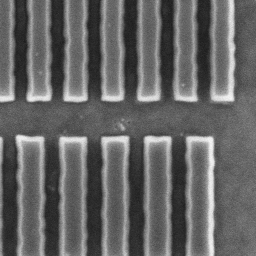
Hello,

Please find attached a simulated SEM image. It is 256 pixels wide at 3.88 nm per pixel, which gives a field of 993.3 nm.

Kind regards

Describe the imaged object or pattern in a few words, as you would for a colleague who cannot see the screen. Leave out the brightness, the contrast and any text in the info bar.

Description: groups of lines, slits or small figures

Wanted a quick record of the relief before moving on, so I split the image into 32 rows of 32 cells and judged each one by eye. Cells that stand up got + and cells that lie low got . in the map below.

++..++..+++..++..+++..++...++...
++..++..+++..++..+++..++...++...
++..++..+++..++..+++..++...++...
++..++..+++..++..+++..++..+++...
++..++..+++..++..+++..++..+++...
++..++..+++..++..+++..++...++...
++..++..+++..++..+++..++...++...
++..++..+++..++...++..++...++...
++..++..+++..++..+++..++...++...
++..++..+++..++...++..++...++...
++..++..+++..++..+++..++...++...
++..++..+++..++..+++..++...++...
................................
................................
................................
................................
................................
..+++...++...+++..+++...++......
..+++...+++..+++..+++...++......
..+++...+++..+++..+++..+++......
..+++...+++..+++..+++...+++.....
..+++...+++..+++..+++...++......
..+++...+++..+++..+++...++......
..+++...+++..+++..+++..+++......
..+++...+++..+++..+++..+++......
..+++...+++..+++..+++...++......
..+++...+++..+++..+++..+++......
..+++...+++..+++..+++..+++......
..+++...+++..+++..+++...++......
..+++...+++..+++..+++...++......
..+++...+++..+++..+++..+++......
..+++...+++..+++..+++..++++.....